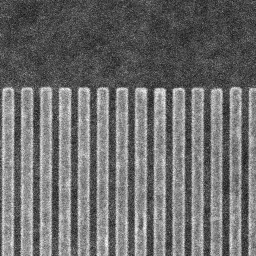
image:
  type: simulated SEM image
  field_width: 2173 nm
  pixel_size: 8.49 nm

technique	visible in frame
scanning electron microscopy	parallel lines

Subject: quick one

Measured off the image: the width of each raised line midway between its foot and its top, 10.9 pixels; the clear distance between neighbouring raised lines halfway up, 70 nanometers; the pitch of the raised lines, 19 px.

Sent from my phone